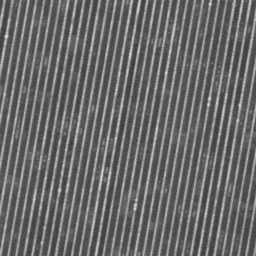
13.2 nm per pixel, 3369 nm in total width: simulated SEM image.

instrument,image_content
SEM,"parallel lines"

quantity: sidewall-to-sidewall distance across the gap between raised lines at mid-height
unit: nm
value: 79.4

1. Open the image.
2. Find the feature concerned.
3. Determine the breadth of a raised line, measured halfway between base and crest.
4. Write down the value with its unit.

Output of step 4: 22.7 nanometres